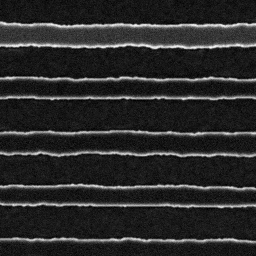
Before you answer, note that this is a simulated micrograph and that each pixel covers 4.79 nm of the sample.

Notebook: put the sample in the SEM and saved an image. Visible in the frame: lines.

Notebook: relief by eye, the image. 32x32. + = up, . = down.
................................
................................
................................
++++++++++++++++++++++++++++++++
++++++++++++++++++++++++++++++++
++++++++++++++++++++++++++++++++
................................
................................
................................
................................
++++++++++++++++++++++++++++++++
++++++++++++++++++++++++++++++++
................................
................................
................................
................................
++..+++...+++++++++..+..........
++++++++++++++++++++++++++++++++
++++++++++++++++++++++++++++++++
.......+..............++.++..+++
................................
................................
................................
++++++++++++++++++++++++++++++++
++++++++++++++++++++++++++++++++
++++++++++++++++++++++++++++++++
................................
................................
................................
................................
++++++++++++++++++++++++++++++++
++++++++++++++++++++++++++++++++